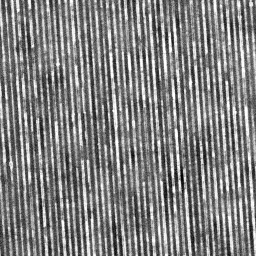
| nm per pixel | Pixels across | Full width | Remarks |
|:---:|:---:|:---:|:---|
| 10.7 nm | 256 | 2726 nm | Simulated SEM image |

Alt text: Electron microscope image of parallel lines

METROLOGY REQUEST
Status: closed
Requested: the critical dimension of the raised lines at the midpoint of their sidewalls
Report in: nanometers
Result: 17.3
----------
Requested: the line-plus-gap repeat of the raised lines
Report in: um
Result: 0.0635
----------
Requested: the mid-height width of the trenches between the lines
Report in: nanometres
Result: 42.5